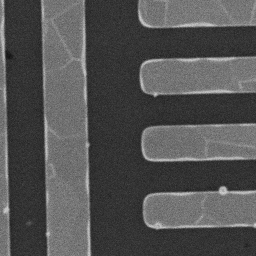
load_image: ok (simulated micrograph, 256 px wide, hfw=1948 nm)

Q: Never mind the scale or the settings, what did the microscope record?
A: groups of lines, slits or small figures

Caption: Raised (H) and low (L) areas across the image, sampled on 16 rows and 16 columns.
LLLHHLLLLHHHHHHH
LLLHHLLLLHHHHHHH
LLLHHLLLLLLLLLLL
LLLHHLLLLLLLLLLL
LLLHHLLLLHHHHHHH
LLLHHLLLLHHHHHHH
LLLHHLLLLLLLLLLL
LLLHHLLLLLLLLLLL
LLLHHLLLLHHHHHHH
LLLHHHLLLHHHHHHH
LLLHHLLLLLLLLLLL
LLLHHLLLLLLLLLLL
HLLHHHLLLHHHHHHH
HLLHHHLLLHHHHHHH
HLLHHHLLLLLLLLLL
HLLHHHLLLLLLLLLL